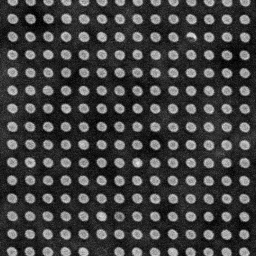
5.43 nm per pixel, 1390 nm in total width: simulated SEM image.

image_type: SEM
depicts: a regular array of raised bodies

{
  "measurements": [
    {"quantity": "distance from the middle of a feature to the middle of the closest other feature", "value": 95.4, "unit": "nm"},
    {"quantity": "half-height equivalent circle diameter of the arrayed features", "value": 50.5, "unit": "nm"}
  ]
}